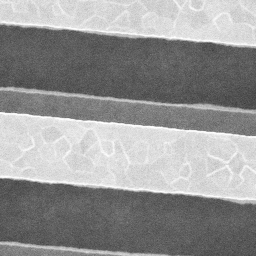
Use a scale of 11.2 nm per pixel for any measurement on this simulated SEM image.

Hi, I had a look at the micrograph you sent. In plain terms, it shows lines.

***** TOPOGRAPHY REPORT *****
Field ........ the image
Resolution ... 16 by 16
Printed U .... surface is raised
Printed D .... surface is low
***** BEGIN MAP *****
UUUUUUUUUUUUUUUU
DUUUUUUUUUUUUUUU
DDDDDDDDDDDDUUUU
DDDDDDDDDDDDDDDD
DDDDDDDDDDDDDDDD
DDDDDDDDDDDDDDDD
UUUUUUUUUUDDDDDD
UUUUUUUUUUUUUUUU
UUUUUUUUUUUUUUUU
UUUUUUUUUUUUUUUU
UUUUUUUUUUUUUUUU
DDDDDUUUUUUUUUUU
DDDDDDDDDDDDDDDU
DDDDDDDDDDDDDDDD
DDDDDDDDDDDDDDDD
UUUDDDDDDDDDDDDD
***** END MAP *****